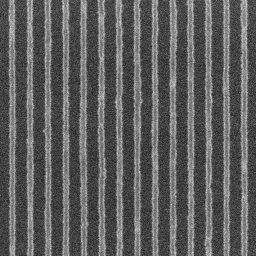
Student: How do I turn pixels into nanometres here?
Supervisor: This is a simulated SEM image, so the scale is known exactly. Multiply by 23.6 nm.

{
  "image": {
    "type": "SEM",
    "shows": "parallel lines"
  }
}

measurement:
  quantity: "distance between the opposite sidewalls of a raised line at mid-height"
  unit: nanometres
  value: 106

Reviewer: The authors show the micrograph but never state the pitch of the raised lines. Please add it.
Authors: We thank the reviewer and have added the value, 0.421 micrometres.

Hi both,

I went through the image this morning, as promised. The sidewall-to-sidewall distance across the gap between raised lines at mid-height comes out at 0.316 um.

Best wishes